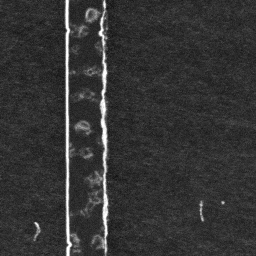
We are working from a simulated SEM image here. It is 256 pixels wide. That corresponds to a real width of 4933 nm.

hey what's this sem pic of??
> one or a few lines or trenches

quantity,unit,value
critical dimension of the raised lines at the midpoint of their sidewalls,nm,718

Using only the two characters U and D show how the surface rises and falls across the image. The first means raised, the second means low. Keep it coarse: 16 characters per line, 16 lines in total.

DDDDUUUDDDDDDDDD
DDDDUUDDDDDDDDDD
DDDDUUDDDDDDDDDD
DDDDUUUDDDDDDDDD
DDDDUUUDDDDDDDDD
DDDDUUUDDDDDDDDD
DDDDUUDDDDDDDDDD
DDDDUUDDDDDDDDDD
DDDDUUUDDDDDDDDD
DDDDUUUDDDDDDDDD
DDDDUUUDDDDDDDDD
DDDDUUUDDDDDDDDD
DDDDUUUDDDDDDDDD
DDDDUUUDDDDDDDDD
DDDDUUUDDDDDDDDD
DDDDUUUDDDDDDDDD